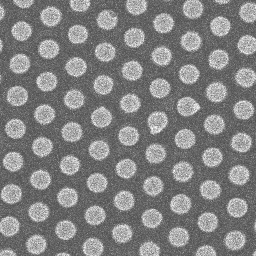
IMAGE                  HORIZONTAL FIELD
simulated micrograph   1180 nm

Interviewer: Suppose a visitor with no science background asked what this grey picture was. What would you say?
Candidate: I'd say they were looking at a regular array of raised bodies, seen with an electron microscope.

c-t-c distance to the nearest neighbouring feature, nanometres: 149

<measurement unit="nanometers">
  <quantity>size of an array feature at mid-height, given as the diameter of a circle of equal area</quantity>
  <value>91.2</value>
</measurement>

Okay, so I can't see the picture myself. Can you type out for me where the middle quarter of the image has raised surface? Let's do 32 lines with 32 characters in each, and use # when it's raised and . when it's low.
######.........####...........##
.####..........####..........###
.####..........####..........###
........###....####..........###
........####..........####....##
.......#####..........####......
........####..........####......
.###.....#............####......
#####..........####...........##
#####.........#####.........####
.###..........#####.........####
........###....###..........####
.......#####..........###....###
.......#####.........#####......
.......#####.........#####......
####....##...........#####......
####..........####....##.....##.
#####.........#####...#.....####
####..........#####.........####
........##....####..........####
......#####..........###.....###
......#####..........####.......
.......####..........####.......
###....###...........####.......
####..........###.....##........
####.........#####..........####
####.........#####.........#####
.#......#....####..........#####
......####...........###....####
......#####.........#####.......
......#####.........#####.......
###....###..........#####.......